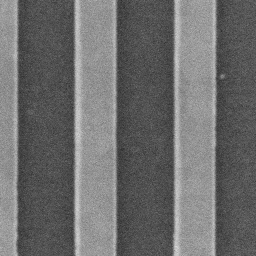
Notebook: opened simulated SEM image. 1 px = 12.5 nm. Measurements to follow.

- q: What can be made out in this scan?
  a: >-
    lines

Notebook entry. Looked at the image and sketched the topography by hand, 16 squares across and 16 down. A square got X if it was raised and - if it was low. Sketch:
X----XX----XX---
X----XX----XX---
X----XX----XX---
X----XX----XX---
X----XX----XX---
X----XX----XX---
X----XX----XX---
X----XX----XX---
X----XX----XX---
X----XX----XX---
X----XX----XX---
X----XX----XX---
X----XX----XX---
X----XX----XX---
X----XX----XX---
X----XX----XX---